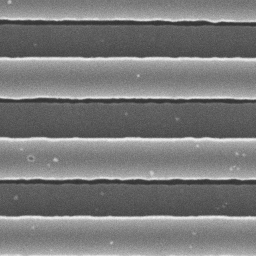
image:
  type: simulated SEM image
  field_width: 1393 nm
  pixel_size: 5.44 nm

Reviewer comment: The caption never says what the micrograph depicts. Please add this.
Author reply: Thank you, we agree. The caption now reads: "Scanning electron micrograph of lines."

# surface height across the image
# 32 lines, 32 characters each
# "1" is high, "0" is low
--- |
11111111111111111111111111111111
11111111111111111111111111111111
00000001000000000110111111111111
00000000000000000000000000000000
00000000000000000000000000000000
00000000000000000000000000000000
00000000000000000000000000000000
11111111111111111111111111111111
11111111111111111111111111111111
11111111111111111111111111111111
11111111111111111111111111111111
11111111111111111111111111111111
00000000000000000000000000000000
00000000000000000000000000000000
00000000000000000000000000000000
00000000000000000000000000000000
00000000000000000000000000000000
11111111111111111111111111111111
11111111111111111111111111111111
11111111111111111111111111111111
11111111111111111111111111111111
11111111111111111111111111111111
00000000000000000000000000000000
00000000000000000000000000000000
00000000000000000000000000000000
00000000000000000000000000000000
00000000000000000000000000000000
11111111111111111111111111111111
11111111111111111111111111111111
11111111111111111111111111111111
11111111111111111111111111111111
11111111111111111111111111111111